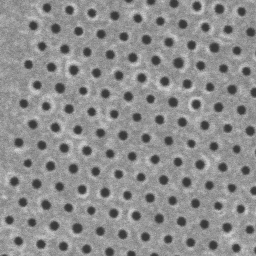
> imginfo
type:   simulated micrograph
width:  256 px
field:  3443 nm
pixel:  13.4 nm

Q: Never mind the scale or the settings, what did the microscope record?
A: a regular array of holes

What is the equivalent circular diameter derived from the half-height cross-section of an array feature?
126 nanometres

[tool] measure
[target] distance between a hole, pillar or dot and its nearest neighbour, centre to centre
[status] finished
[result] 301 nanometers